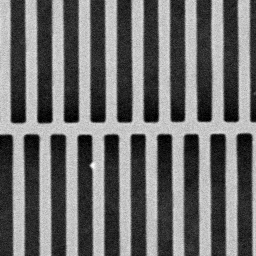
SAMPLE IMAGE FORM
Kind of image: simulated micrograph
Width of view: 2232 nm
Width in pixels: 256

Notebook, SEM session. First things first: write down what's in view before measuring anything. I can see groups of lines, slits or small figures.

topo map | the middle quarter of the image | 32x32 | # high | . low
....##.....##....###....##.....#
....##.....##....###....##.....#
....##.....##....###....##.....#
....##.....##....###....##.....#
....##.....##....###....##.....#
....##.....##....###....##.....#
....##.....##....###....##....##
....##.....##....###....##....##
....##.....##....###....##....##
....##.....##....###....##....##
....##.....##....###....##....##
....##.....##....###....##....##
....##.....##....###....##....##
....##.....##....###....##....##
....###...###....###....###...##
################################
################################
###########..####...####..#####.
.##....###....##.....##....###..
.##....###....##.....##....###..
.##....###....##.....##....###..
.##....###....##.....##....###..
.##....###....##.....##....###..
.##....###....##.....##....###..
.##....###....##.....##....###..
.##....###....##.....##....###..
.##....###....##.....##....###..
.##....###....##.....##....###..
.##....###....##.....##....###..
.##....###....##.....##....###..
.##....###....##.....##....###..
.##....###....##.....##....###..